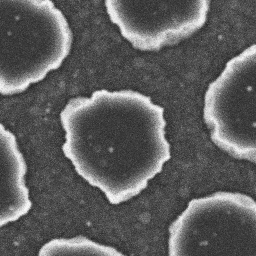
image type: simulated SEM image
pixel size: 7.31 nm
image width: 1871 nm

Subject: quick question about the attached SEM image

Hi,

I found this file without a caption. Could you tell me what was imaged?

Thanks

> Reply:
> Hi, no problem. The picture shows raised bodies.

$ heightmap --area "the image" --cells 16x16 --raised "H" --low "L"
HHHLLLLHHHHHHLLL
HHHHLLLHHHHHLLLL
HHHHLLLLHHLLLLLL
HHHHLLLLLLLLLLLH
HHHLLLLLLLLLLLHH
HLLLLLLLLLLLLHHH
LLLLLHHHHHLLLHHH
LLLLHHHHHHLLLHHH
HLLLHHHHHHLLLLHH
HLLLHHHHHHHLLLLH
HLLLLHHHHHLLLLLL
HLLLLLHHHLLLLLLL
HHLLLLLLLLLLHHHL
HLLLLLLLLLLHHHHH
LLLLLLLLLLLHHHHH
LLLHHHLLLLLHHHHH